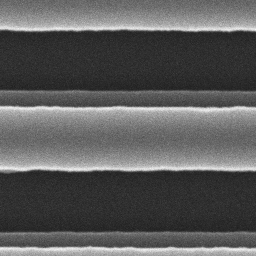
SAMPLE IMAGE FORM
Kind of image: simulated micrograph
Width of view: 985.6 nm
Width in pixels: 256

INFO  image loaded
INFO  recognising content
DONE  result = lines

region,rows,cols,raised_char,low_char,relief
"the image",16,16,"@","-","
@@@@@@@@@@@@@@@@
@@@@@@@@@@@@@@@@
----------------
----------------
----------------
----------------
----------------
@@@@@@@@@@@@@@@@
@@@@@@@@@@@@@@@@
@@@@@@@@@@@@@@@@
@@@@@@@@@@@@@@@@
----------------
----------------
----------------
----------------
@@@@@@@@@-@-@@@@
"